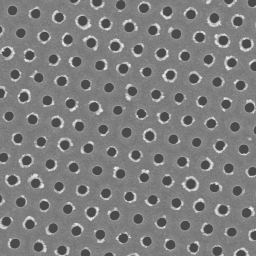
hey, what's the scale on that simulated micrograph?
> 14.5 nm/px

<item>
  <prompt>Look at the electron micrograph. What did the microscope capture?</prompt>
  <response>a regular array of holes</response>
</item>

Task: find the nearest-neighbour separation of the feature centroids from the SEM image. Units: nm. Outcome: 342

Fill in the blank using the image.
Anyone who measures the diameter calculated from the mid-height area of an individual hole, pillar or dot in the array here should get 139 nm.